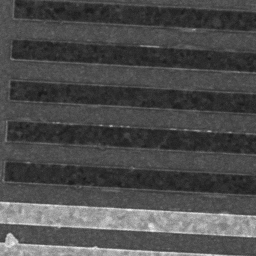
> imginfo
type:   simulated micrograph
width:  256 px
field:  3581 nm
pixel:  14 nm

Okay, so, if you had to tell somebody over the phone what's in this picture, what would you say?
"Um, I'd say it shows parallel lines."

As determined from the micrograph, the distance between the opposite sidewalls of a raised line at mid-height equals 20.2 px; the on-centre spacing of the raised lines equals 572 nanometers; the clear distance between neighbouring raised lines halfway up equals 281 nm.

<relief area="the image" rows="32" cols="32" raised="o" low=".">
..oooooooooooo..................
..oooooooooooooooooooooooooooooo
....oooooooooooooooooooooooooooo
....................o.oooooooooo
................................
..oooooooooo....................
.ooooooooooooooooooooooooooooo..
....oooooooooooooooooooooooooooo
......................oooooooooo
................................
.ooooooooo......................
.oooooooooooooooooooooooooo.....
.ooooooooooooooooooooooooooooooo
...................ooooooooooooo
................................
.ooooooo........................
.ooooooooooooooooooooooooo......
.ooooooooooooooooooooooooooooooo
............o...oooooooooooooooo
..o.............................
.oooo...........................
oooooooooooooooooooooooo........
.ooooooooooooooooooooooooooooooo
..............oooooooooooooooooo
................................
ooo..................o..........
ooooooooooooooooooooooo.........
oooooooooooooooooooooooooooooooo
.............ooooooooooooooooooo
.o.............................o
ooo.............................
ooooooooooooooooooo..o..........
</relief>